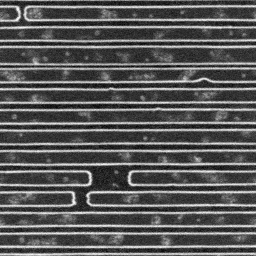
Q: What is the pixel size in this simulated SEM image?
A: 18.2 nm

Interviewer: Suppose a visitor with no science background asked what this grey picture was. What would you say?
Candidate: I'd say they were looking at parallel lines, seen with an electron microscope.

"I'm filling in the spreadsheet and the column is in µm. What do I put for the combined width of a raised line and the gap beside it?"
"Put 0.376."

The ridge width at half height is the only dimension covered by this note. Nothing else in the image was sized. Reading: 248 nanometres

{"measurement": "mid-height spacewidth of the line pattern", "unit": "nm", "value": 125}